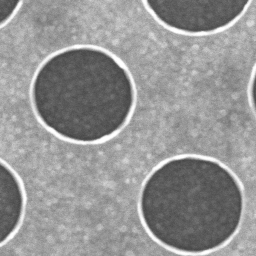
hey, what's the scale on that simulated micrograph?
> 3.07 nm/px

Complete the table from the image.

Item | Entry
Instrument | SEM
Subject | holes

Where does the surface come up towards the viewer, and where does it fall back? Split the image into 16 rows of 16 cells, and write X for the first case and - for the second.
-XXXXXXXX------X
XXXXXXXXXX----XX
XXXXXXXXXXXXXXXX
XXX----XXXXXXXXX
XX------XXXXXXXX
XX------XXXXXXXX
XX------XXXXXXXX
XXX-----XXXXXXXX
XXXX---XXXXXXXXX
XXXXXXXXXXXXXXXX
XXXXXXXXXX----XX
-XXXXXXXX------X
-XXXXXXXX------X
-XXXXXXXX------X
-XXXXXXXX------X
XXXXXXXXXXX--XXX